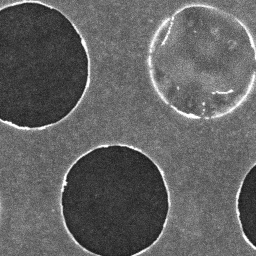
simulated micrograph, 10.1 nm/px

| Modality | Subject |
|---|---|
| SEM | holes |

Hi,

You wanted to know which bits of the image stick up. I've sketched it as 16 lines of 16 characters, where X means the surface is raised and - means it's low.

---XXXXXXXXXXXXX
----XXXXXXXXXXXX
-----XXXXXXXXXXX
-----XXXXXXXXXXX
------XXXXXXXXXX
-----XXXXXXXXXXX
-----XXXXXXXXXXX
----XXXXXXXXXXXX
XXXXXXXXXXXXXXXX
XXXXXX---XXXXXXX
XXXX------XXXXXX
XXXX------XXXXX-
XXXX-------XXXX-
XXXX------XXXXX-
XXXX------XXXXX-
XXXXX----XXXXXXX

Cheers